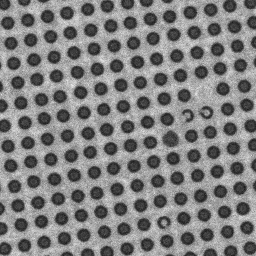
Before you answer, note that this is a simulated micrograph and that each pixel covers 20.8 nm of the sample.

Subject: a regular array of ring-shaped grooves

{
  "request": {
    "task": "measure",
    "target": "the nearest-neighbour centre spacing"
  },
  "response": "408 nm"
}